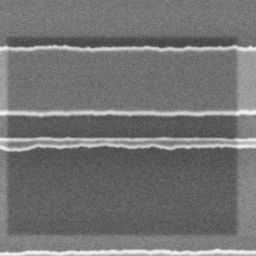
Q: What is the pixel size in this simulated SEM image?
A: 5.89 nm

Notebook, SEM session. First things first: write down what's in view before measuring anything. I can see lines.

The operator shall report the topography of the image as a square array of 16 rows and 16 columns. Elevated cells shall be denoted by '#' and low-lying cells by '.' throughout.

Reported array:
................
................
................
################
################
################
################
################
################
................
................
................
................
................
................
................